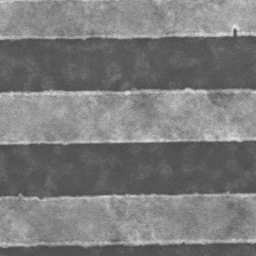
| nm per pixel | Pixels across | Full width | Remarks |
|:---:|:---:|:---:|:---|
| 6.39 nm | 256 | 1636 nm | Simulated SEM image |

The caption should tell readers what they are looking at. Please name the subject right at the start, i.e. one or a few lines or trenches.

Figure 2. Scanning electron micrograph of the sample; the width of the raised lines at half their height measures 304 nm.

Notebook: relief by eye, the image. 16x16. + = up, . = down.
++++++++++++++++
++++++++++++++++
................
................
................
................
++++++++++++++++
++++++++++++++++
++++++++++++++++
................
................
................
++++++++++++++++
++++++++++++++++
++++++++++++++++
................